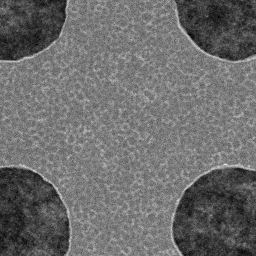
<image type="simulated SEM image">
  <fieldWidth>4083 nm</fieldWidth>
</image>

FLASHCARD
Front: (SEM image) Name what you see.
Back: holes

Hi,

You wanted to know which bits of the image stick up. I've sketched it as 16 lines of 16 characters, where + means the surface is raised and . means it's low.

....+++++++.....
....+++++++.....
...+++++++++....
..+++++++++++...
++++++++++++++++
++++++++++++++++
++++++++++++++++
++++++++++++++++
++++++++++++++++
++++++++++++++++
.+++++++++++++.+
...+++++++++....
....+++++++.....
....+++++++.....
....+++++++.....
....+++++++.....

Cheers